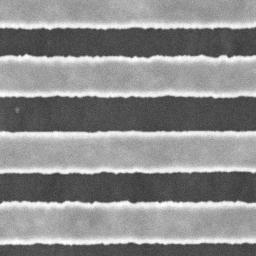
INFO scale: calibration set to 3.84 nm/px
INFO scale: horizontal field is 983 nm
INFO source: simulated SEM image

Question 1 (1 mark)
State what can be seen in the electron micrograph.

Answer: lines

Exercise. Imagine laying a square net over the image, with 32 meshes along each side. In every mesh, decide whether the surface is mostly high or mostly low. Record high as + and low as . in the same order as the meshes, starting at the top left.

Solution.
++++++++++++++++++++++++++++++++
++++++++++++++++++++++++++++++++
++++++++++++++++++++++++++++++++
..+++.+....+++.+..+++..++.+.....
................................
................................
................................
++++++++++++++++++++++++++++++++
++++++++++++++++++++++++++++++++
++++++++++++++++++++++++++++++++
++++++++++++++++++++++++++++++++
++++++++++++++++++++++++++++++++
................................
................................
................................
................................
+.............++++..++.+++++++++
++++++++++++++++++++++++++++++++
++++++++++++++++++++++++++++++++
++++++++++++++++++++++++++++++++
++++++++++++++++++++++++++++++++
+++++++++++++.++++++++.+.......+
................................
................................
................................
++++++++++++++++++++++++++++++++
++++++++++++++++++++++++++++++++
++++++++++++++++++++++++++++++++
++++++++++++++++++++++++++++++++
++++++++++++++++++++++++++++++++
++++....++++....................
................................